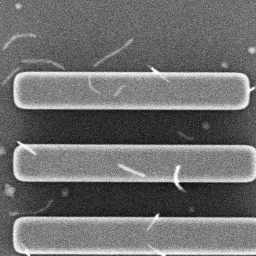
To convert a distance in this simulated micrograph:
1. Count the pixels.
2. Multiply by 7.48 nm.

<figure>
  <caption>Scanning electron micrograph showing groups of lines, slits or small figures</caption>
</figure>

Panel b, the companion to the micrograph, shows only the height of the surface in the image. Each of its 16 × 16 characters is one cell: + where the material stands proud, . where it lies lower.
................
................
................
................
.........+......
.+++++++++++++++
.++++++++++++++.
................
................
.+++++++++++++++
.+++++++++++++++
................
................
................
.+++++++++++++++
.+++++++++++++++